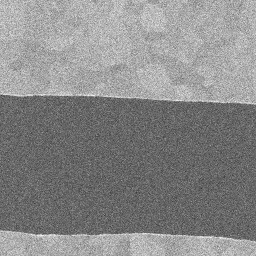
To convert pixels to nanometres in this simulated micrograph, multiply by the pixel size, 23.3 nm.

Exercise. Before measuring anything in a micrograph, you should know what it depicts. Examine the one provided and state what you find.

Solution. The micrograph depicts one or a few lines or trenches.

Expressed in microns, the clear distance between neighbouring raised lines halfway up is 3.19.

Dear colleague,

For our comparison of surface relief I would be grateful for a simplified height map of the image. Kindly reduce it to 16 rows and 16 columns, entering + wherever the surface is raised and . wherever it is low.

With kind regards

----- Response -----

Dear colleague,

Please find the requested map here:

++++++++++++++++
++++++++++++++++
++++++++++++++++
++++++++++++++++
++++++++++++++++
++++++++++++++++
................
................
................
................
................
................
................
................
+...............
++++++++++++++++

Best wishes